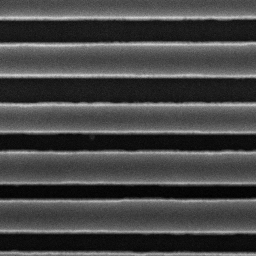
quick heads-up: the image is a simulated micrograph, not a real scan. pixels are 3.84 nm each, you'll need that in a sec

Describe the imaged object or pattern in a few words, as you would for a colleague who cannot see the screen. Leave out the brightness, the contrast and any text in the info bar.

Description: lines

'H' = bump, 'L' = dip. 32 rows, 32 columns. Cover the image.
HHHHHHHHHHHHHHHHHHHHHHHHHHHHHHHH
HHHHHHHHHHHHHHHHHHHHHHHHHHHHHHHH
LLLLLLLLLLLLLLLLLLLLLLLLLLLLLLLL
LLLLLLLLLLLLLLLLLLLLLLLLLLLLLLLL
LLLLLLLLLLLLLLLLLLLLLLLLLLLLLLLL
HHHHHHHHHHHHHHHHHHHHHHHHHHHHHHHH
HHHHHHHHHHHHHHHHHHHHHHHHHHHHHHHH
HHHHHHHHHHHHHHHHHHHHHHHHHHHHHHHH
HHHHHHHHHHHHHHHHHHHHHHHHHHHHHHHH
HHHHHHHHHHHHHHHHHHHHHHHHHHHHHHHH
LLLLLLLLLLLLLLLLLLLLLLLLLLLLLLLL
LLLLLLLLLLLLLLLLLLLLLLLLLLLLLLLL
LLLLLLLLLLLLLLLLLLLLLLLLLLLLLLLL
HHHHHHHHHHHHHHHHHHHHHHHHHHHHHHHH
HHHHHHHHHHHHHHHHHHHHHHHHHHHHHHHH
HHHHHHHHHHHHHHHHHHHHHHHHHHHHHHHH
HHHHHHHHHHHHHHHHHHHHHHHHHHHHHHHH
LLLLLLLLLLLLLLLLLLLLLLLLLLLLLLLL
LLLLLLLLLLLLLLLLLLLLLLLLLLLLLLLL
HHHHHHHHHHHHHHHHHHHHHHHHHHHHHHHH
HHHHHHHHHHHHHHHHHHHHHHHHHHHHHHHH
HHHHHHHHHHHHHHHHHHHHHHHHHHHHHHHH
HHHHHHHHHHHHHHHHHHHHHHHHHHHHHHHH
LLLLLLLLLLLLLLLLLLLLLLLLLLLLLLLL
LLLLLLLLLLLLLLLLLLLLLLLLLLLLLLLL
HHHHHHHHHHHHHHHHHHHHHHHHHHHHHHHH
HHHHHHHHHHHHHHHHHHHHHHHHHHHHHHHH
HHHHHHHHHHHHHHHHHHHHHHHHHHHHHHHH
HHHHHHHHHHHHHHHHHHHHHHHHHHHHHHHH
LLLLLLLLLLLLLLLLLLLLLLLLLLLLLLLL
LLLLLLLLLLLLLLLLLLLLLLLLLLLLLLLL
LLLLLLLLLLLLLLLLLLLLLLLLLLLLLLLL